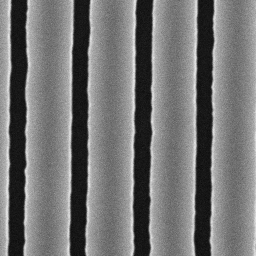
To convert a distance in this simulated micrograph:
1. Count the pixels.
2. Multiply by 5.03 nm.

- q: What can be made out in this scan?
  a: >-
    lines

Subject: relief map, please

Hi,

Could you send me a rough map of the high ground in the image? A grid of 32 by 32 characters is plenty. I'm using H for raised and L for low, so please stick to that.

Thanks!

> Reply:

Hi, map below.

HLLHHHHHHLLHHHHHHLLHHHHHHLLHHHHH
HLLHHHHHHLLHHHHHHLLHHHHHHLLHHHHH
HLLHHHHHHLLHHHHHHLLHHHHHHLLHHHHH
HLLHHHHHHLLHHHHHHLLHHHHHHLLHHHHH
HLLHHHHHHLLHHHHHHLLHHHHHHLLHHHHH
HLLHHHHHHLLHHHHHHLLHHHHHHLLHHHHH
HLLHHHHHHLLHHHHHHLLHHHHHHLLHHHHH
HLLHHHHHHLLHHHHHHLLHHHHHHLLHHHHH
HLLHHHHHHLLHHHHHHLLHHHHHHLLHHHHH
HLLHHHHHHLLHHHHHHLLHHHHHHLLHHHHH
HLLHHHHHHLLHHHHHHLLHHHHHHLLHHHHH
HLLHHHHHHLLHHHHHHLLHHHHHHLLHHHHH
HLLHHHHHHLLHHHHHHLLHHHHHHLLHHHHH
HLLHHHHHHLLHHHHHHLLHHHHHHLLHHHHH
HLLHHHHHHLLHHHHHHLLHHHHHHLLHHHHH
HLLHHHHHHLLHHHHHHLLHHHHHHLLHHHHH
HLLHHHHHHLLHHHHHHLLHHHHHHLLHHHHH
HLLHHHHHHLLHHHHHHLLHHHHHHLLHHHHH
HLLHHHHHHLLHHHHHHLLHHHHHHLHHHHHH
HLLHHHHHHLLHHHHHHLLHHHHHHLHHHHHH
HLLHHHHHHLLHHHHHHLLHHHHHLLHHHHHH
HLLHHHHHHLLHHHHHHLLHHHHHLLHHHHHH
HLLHHHHHHLLHHHHHHLLHHHHHLLHHHHHH
HLLHHHHHHLLHHHHHHLLHHHHHLLLHHHHH
HLLHHHHHHLLHHHHHHLLHHHHHLLHHHHHH
HLLHHHHHHLLHHHHHHLLHHHHHLLHHHHHH
HLLHHHHHHLLHHHHHHLLHHHHHLLHHHHHH
HLLHHHHHHLLHHHHHHLLHHHHHLLHHHHHH
HLLHHHHHHLLHHHHHHLLHHHHHLLHHHHHH
HLLHHHHHHLLHHHHHHLLHHHHHLLHHHHHH
HLLHHHHHHLLHHHHHHLLHHHHHLLHHHHHH
HLLHHHHHHLLHHHHHHLLHHHHHLLHHHHHH